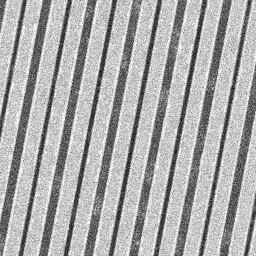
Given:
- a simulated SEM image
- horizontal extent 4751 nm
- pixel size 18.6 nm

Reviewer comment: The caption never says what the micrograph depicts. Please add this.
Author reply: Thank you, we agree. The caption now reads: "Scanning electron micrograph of parallel lines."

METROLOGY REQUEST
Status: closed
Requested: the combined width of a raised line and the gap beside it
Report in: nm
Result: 410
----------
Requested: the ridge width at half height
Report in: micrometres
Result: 0.262